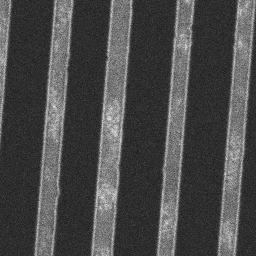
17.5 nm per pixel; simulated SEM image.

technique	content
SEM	one or a few lines or trenches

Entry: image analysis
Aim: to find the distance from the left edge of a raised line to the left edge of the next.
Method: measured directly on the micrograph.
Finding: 61.3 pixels